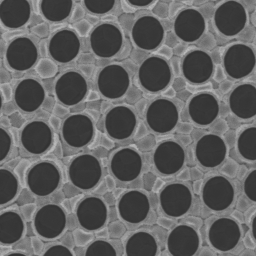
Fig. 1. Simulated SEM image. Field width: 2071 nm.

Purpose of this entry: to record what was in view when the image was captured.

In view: a regular array of holes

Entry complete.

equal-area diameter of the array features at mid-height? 258 nm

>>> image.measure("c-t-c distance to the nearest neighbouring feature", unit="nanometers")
339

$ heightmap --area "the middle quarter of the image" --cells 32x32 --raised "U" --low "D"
UUUUUUUUUUUDDDUUUUUDDDDDDDUUUUDD
UUUUUUUUUUDDDDDUUUUDDDDDDDDUUUDD
DDDDUUUUUDDDDDDDUUUDDDDDDDDUUUDD
DDDDDUUUUDDDDDDDUUUDDDDDDDDUUUUD
DDDDDUUUDDDDDDDDUUUDDDDDDDUUUUUU
DDDDDDUUUDDDDDDDUUUUDDDDDUUUUUUU
DDDDDDUUUDDDDDDDUUUUUDDDUUUUUUUU
DDDDDUUUUUDDDDDUUUUUUUUUUUUUUUUU
DDDDDUUUUUUDDUUUUUUUUUUUUUUUUUUU
DDDDUUUUUUUUUUUUUUUUUUDDDDDUUUUU
UUUUUUUUUUUUUUUUUUUUUDDDDDDDUUUD
UUUUUUUUUUUUDDDDDUUUUDDDDDDDUUUD
UUUUUUUUUUUDDDDDDUUUUDDDDDDDDUUD
UDDDDDUUUUDDDDDDDDUUUDDDDDDDDUUU
DDDDDDDUUUDDDDDDDDUUUDDDDDDDUUUU
DDDDDDDUUUDDDDDDDDUUUDDDDDDDUUUU
DDDDDDDUUUUDDDDDDUUUUUDDDDDUUUUU
DDDDDDDUUUUDDDDDDUUUUUUUUUUUUUUU
DDDDDDDUUUUUDDDUUUUUUUUUUUUUUUUU
UDDDDDUUUUUUUUUUUUUUUUUUUUDDUUUU
UUDDDUUUUUUUUUUUUUUUUUUUDDDDDUUU
UUUUUUUUUUUUUUDDDUUUUUUDDDDDDDUU
UUUUUUUUUUUUUDDDDDDUUUUDDDDDDDUU
UUUDDDDDUUUUDDDDDDDUUUDDDDDDDDUU
UUDDDDDDDUUUDDDDDDDUUUUDDDDDDDUU
UDDDDDDDDUUUDDDDDDDUUUUDDDDDDDUU
UDDDDDDDDUUUDDDDDDDUUUUUDDDDDUUU
UDDDDDDDDUUUDDDDDDDUUUUUUDDUUUUU
UUDDDDDDDUUUUDDDDDUUUUUUUUUUUUUU
UUDDDDDDUUUUUUUUUUUUUUUUUUUUUUUU
UUUDDDDDUUUUUUUUUUUUUUUUUUDDDDUU
UUUUUUUUUUUUUUUUUUUUUUUUUDDDDDDU